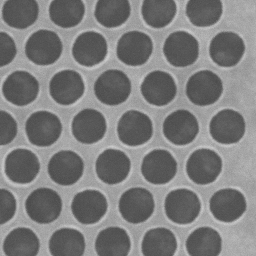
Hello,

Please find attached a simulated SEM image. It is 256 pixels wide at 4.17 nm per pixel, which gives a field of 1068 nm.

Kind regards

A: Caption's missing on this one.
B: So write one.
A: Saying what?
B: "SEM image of a regular array of holes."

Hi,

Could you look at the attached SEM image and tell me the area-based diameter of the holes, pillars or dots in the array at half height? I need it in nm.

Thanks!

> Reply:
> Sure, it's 157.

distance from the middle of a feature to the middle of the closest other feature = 0.187 µm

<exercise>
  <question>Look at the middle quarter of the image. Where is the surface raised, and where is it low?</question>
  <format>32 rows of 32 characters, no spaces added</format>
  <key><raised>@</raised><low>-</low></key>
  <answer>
@@@@@---@@@@@@@@---@@@@@@@@----@
--@@@@@@@@@---@@@@@@@@---@@@@@@@
----@@@@@------@@@@@@------@@@@@
-----@@@--------@@@@--------@@@-
-----@@@---------@@---------@@@-
------@----------@@---------@@--
------@----------@@---------@@--
-----@@@---------@@---------@@--
----@@@@--------@@@@--------@@@-
---@@@@@@------@@@@@@------@@@@@
-@@@@@@@@@@-@@@@@@@@@@@--@@@@@@@
@@@@----@@@@@@@@--@@@@@@@@@@---@
@@@-------@@@@@------@@@@@------
@@--------@@@@--------@@@-------
@@---------@@@--------@@@-------
@@---------@@---------@@--------
@@---------@@---------@@--------
@@--------@@@---------@@@-------
@@@-------@@@---------@@@-------
@@@@-----@@@@@-------@@@@@------
@@@@@@@@@@@@@@@@---@@@@@@@@@--@@
-@@@@@@@@@----@@@@@@@@----@@@@@@
---@@@@@@-------@@@@-------@@@@@
----@@@@--------@@@@--------@@@-
-----@@@---------@@---------@@--
-----@@@---------@@----------@--
-----@@@---------@@----------@--
-----@@@--------@@@---------@@--
----@@@@@-------@@@@--------@@@-
---@@@@@@------@@@@@@------@@@@@
-@@@@@@@@@@@@@@@@@@@@@@@@@@@@@@@
@@@@@----@@@@@@@-----@@@@@@-----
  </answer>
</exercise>